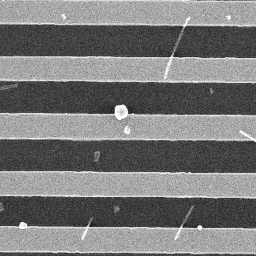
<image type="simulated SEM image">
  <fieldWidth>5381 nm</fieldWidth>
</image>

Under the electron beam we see lines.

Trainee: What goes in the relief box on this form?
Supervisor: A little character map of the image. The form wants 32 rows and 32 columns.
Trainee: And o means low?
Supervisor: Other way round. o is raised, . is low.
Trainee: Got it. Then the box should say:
oooooooooooooooooooooooooooooooo
oooooooooooooooooooooooooooooooo
oooooooooooooooooooooooooooooooo
................................
................................
................................
................................
oooooooooooooooooooooooooooooooo
oooooooooooooooooooooooooooooooo
oooooooooooooooooooooooooooooooo
................................
................................
................................
...............o................
oooooooooooooooooooooooooooooo..
oooooooooooooooooooooooooooooooo
oooooooooooooooooooooooooooooooo
...............................o
................................
................................
................................
oooooooooooo....................
oooooooooooooooooooooooooooooooo
oooooooooooooooooooooooooooooooo
........oooooooooooooooooooooooo
................................
................................
................................
ooooooooooooooooooooo.o.oo......
oooooooooooooooooooooooooooooooo
oooooooooooooooooooooooooooooooo
....o.oooooooooooooooooooooooooo